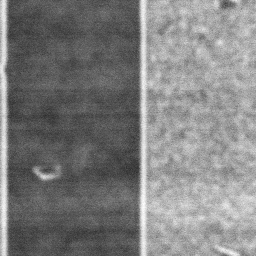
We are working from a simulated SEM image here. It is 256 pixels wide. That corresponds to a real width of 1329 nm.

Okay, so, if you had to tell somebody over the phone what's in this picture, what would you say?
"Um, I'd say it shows one or a few lines or trenches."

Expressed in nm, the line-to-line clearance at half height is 720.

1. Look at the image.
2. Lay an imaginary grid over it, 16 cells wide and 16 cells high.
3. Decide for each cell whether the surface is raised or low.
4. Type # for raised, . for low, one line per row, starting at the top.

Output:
.........#######
.........#######
.........#######
.........#######
.........#######
.........#######
.........#######
.........#######
.........#######
.........#######
.........#######
.........#######
.........#######
.........#######
.........#######
.........#######